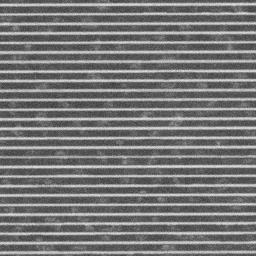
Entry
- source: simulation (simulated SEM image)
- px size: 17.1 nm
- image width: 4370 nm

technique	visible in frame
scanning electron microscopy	parallel lines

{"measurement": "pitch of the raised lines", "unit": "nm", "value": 163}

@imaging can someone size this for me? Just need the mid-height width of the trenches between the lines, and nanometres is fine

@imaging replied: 141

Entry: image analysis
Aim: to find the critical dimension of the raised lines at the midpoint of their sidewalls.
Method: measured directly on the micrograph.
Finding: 1.38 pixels